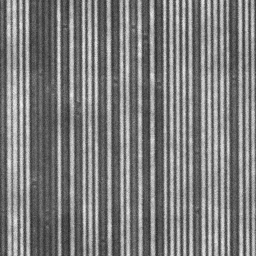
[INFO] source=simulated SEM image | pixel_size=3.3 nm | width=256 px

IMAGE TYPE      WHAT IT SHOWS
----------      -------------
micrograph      parallel lines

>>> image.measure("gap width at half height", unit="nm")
12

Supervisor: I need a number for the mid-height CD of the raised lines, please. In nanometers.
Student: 9.5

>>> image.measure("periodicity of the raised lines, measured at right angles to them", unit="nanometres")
20.7